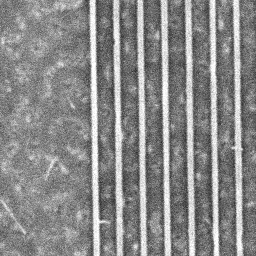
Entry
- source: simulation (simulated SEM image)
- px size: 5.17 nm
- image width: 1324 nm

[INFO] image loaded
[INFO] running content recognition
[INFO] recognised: parallel lines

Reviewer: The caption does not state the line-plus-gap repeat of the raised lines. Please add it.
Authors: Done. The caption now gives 23.9 px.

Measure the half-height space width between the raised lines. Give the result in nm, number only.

101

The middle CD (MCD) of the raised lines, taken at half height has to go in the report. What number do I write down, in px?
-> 4.87